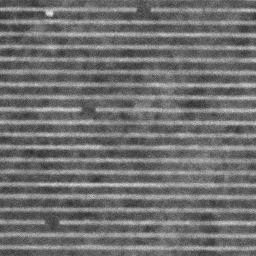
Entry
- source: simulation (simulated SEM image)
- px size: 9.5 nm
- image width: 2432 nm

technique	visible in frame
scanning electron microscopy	parallel lines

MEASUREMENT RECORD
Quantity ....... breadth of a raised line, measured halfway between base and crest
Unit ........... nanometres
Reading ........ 27.3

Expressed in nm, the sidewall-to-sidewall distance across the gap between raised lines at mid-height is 92.6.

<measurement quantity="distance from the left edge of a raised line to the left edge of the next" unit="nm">119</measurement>